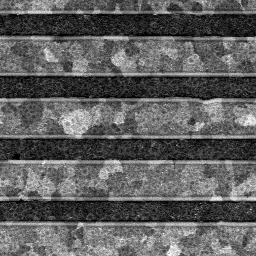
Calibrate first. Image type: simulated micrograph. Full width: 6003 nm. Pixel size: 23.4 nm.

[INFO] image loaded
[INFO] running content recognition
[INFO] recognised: one or a few lines or trenches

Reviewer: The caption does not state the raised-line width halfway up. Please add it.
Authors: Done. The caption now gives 844 nm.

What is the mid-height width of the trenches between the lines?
25.4 pixels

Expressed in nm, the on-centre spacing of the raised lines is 1450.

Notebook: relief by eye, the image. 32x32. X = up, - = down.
XXXXXXXXXXXXXXXXXXXXXXXXXXXXXXXX
--------------------------------
--------------------------------
--------------------------------
--------------------------------
XXXXXXXXXXXXXXXXXXXXXXXXXXXXXXXX
XXXXXXXXXXXXXXXXXXXXXXXXXXXXXXXX
XXXXXXXXXXXXXXXXXXXXXXXXXXXXXXXX
XXXXXXXXXXXXXXXXXXXXXXXXXXXXXXXX
--------------------------------
--------------------------------
--------------------------------
--------------------------------
XXXXXXXXXXXXXXXXXXXXXXXXXXXXXXXX
XXXXXXXXXXXXXXXXXXXXXXXXXXXXXXXX
XXXXXXXXXXXXXXXXXXXXXXXXXXXXXXXX
XXXXXXXXXXXXXXXXXXXXXXXXXXXXXXXX
--------------------------------
--------------------------------
--------------------------------
XXXXXXXXXXXXXXXXXXXXXXXXXXXXXXXX
XXXXXXXXXXXXXXXXXXXXXXXXXXXXXXXX
XXXXXXXXXXXXXXXXXXXXXXXXXXXXXXXX
XXXXXXXXXXXXXXXXXXXXXXXXXXXXXXXX
XXXXXXXXXXXXXXXXXXXXXXXXXXXXXXXX
--------------------------------
--------------------------------
--------------------------------
XXXXXXXXXXXXXXXXXXXXXXXXXXXXXXXX
XXXXXXXXXXXXXXXXXXXXXXXXXXXXXXXX
XXXXXXXXXXXXXXXXXXXXXXXXXXXXXXXX
XXXXXXXXXXXXXXXXXXXXXXXXXXXXXXXX